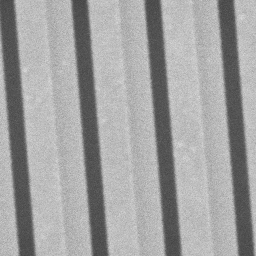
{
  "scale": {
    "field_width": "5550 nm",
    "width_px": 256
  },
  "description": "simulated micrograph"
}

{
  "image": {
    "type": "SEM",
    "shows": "lines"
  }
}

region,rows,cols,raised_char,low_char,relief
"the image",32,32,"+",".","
..+++++++..+++++++..+++++++..+++
..+++++++..+++++++..+++++++..+++
..+++++++..+++++++..+++++++..+++
..+++++++..+++++++..+++++++...++
..+++++++..+++++++...+++++++..++
..+++++++...++++++...+++++++..++
..+++++++...++++++...+++++++..++
..+++++++...+++++++..+++++++..++
...+++++++..+++++++..+++++++..++
...+++++++..+++++++..+++++++..++
+..+++++++..+++++++..+++++++..++
+..+++++++..+++++++..+++++++..++
+..+++++++..+++++++..+++++++..++
+..+++++++..+++++++..+++++++..++
+..+++++++..+++++++..+++++++..++
+..+++++++..+++++++..+++++++...+
+..+++++++..+++++++...++++++...+
+..+++++++...++++++...+++++++..+
+..+++++++...+++++++..+++++++..+
+..+++++++...+++++++..+++++++..+
+...+++++++..+++++++..+++++++..+
+...+++++++..+++++++..+++++++..+
++..+++++++..+++++++..+++++++..+
++..+++++++..+++++++..+++++++..+
++..+++++++..+++++++..+++++++..+
++..+++++++..+++++++..+++++++..+
++..+++++++..+++++++..+++++++..+
++..+++++++..+++++++..+++++++...
++..+++++++..+++++++..+++++++...
++..+++++++..+++++++...+++++++..
++..+++++++...+++++++..+++++++..
++..+++++++...+++++++..+++++++..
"